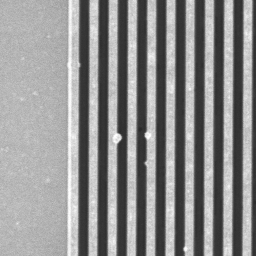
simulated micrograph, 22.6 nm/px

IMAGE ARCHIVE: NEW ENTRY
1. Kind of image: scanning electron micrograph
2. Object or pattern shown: parallel lines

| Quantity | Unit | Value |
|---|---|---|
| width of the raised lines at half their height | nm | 209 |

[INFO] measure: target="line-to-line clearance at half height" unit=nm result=226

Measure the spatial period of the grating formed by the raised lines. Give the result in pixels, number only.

19.2